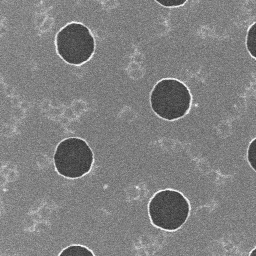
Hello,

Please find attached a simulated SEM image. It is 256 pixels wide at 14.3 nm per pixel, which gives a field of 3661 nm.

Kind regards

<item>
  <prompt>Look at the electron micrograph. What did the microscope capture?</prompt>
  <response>holes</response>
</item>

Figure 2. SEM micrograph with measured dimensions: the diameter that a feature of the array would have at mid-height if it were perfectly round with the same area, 39.7 px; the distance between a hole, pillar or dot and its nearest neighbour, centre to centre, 109 pixels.